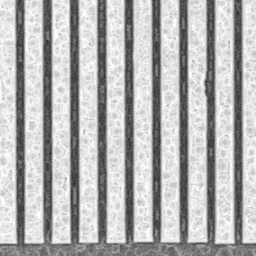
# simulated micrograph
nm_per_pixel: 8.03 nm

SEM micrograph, parallel lines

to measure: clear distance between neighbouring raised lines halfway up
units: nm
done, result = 75.3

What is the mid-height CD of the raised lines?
17.7 pixels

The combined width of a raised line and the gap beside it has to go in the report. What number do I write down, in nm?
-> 218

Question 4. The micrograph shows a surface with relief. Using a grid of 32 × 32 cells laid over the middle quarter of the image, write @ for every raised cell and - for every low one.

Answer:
@---@@@@---@@@@--@@@@@---@@@@--@
@---@@@@---@@@@---@@@@---@@@@--@
@---@@@@---@@@@---@@@@---@@@@--@
@---@@@@---@@@@---@@@@---@@@@--@
@---@@@@---@@@@---@@@@---@@@@--@
@---@@@@---@@@@---@@@@--@@@@@--@
@---@@@@---@@@@---@@@@--@@@@@--@
@---@@@@---@@@@---@@@@---@@@@--@
@---@@@@---@@@@---@@@@---@@@@--@
@---@@@@---@@@@---@@@@---@@@@--@
@---@@@@---@@@@---@@@@---@@@@--@
@---@@@@---@@@@---@@@@---@@@@--@
@---@@@@---@@@@---@@@@---@@@@--@
@---@@@@---@@@@---@@@@---@@@@--@
@---@@@@---@@@@---@@@@---@@@@--@
@---@@@@---@@@@---@@@@---@@@@--@
@---@@@@---@@@@---@@@@---@@@@--@
@---@@@@---@@@@---@@@@---@@@@--@
@---@@@@---@@@@---@@@@---@@@@--@
@---@@@@---@@@@---@@@@---@@@@--@
@---@@@@---@@@@---@@@@---@@@@--@
@---@@@@---@@@@---@@@@---@@@@--@
@---@@@@---@@@@---@@@@---@@@@--@
@---@@@@---@@@@---@@@@---@@@@--@
@---@@@@---@@@@---@@@@---@@@@--@
@---@@@@---@@@@---@@@@--@@@@@--@
@---@@@@---@@@@---@@@@---@@@@--@
@---@@@@---@@@@---@@@@---@@@@--@
@---@@@@---@@@@---@@@@---@@@@--@
@---@@@@---@@@@---@@@@---@@@@--@
@---@@@@---@@@@---@@@@---@@@@--@
@---@@@@---@@@@---@@@@---@@@@--@